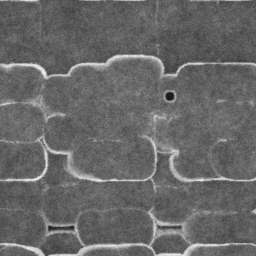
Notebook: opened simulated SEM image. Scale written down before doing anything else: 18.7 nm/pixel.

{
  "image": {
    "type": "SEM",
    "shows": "wiring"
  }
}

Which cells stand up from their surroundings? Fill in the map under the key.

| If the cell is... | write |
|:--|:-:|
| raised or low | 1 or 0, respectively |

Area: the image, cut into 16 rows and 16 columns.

0000000000000000
0000000000000000
0000000000000000
0000000000000000
1110111111011111
1111111111111111
1111111111111111
1111111111111111
1111111111111111
1111111111111111
1110111111011111
0000000000000000
0000000000000000
0000000000000000
0000000000000000
1100011110001111